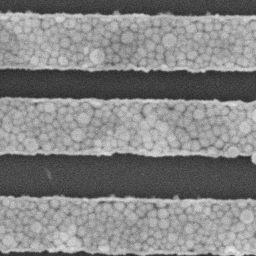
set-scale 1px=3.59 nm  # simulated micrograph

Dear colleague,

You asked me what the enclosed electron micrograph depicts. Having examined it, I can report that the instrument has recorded lines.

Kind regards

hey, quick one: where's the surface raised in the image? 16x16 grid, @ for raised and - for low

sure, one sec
----------------
@@@@@@@@@@@@@@@@
@@@@@@@@@@@@@@@@
@@@@@@@@@@@@@@@@
------------@---
----------------
@@@@@@@@@@@@@@@@
@@@@@@@@@@@@@@@@
@@@@@@@@@@@@@@@@
@@@@@@@@@@@@@@@@
----------------
----------------
@@@@@@@@@@@@@@@@
@@@@@@@@@@@@@@@@
@@@@@@@@@@@@@@@@
@@@@@@@@@@@@@@@@